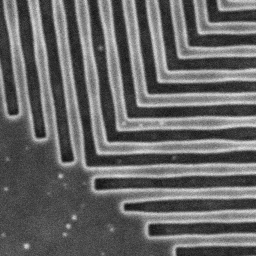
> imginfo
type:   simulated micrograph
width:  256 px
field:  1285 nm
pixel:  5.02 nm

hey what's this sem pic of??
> groups of lines, slits or small figures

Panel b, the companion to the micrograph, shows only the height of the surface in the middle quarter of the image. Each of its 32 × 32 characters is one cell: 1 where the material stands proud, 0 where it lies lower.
11000111000111000111000111000000
11000111000111000111000111000000
11000011000111000111000111111111
11000011000111000011000111111111
11000011000011000011000011111111
11000011000011000011000000000000
11100011000011000011000000000000
11100011000011100011100000000000
01100011100011100011111111111111
01100001100001100011111111111111
01100001100001100000000000000000
01100001100001100000000000000000
01110001100001100000000000000000
01110001100001110000000000000000
01110001110001111111111111111111
01110001110001111111111111111111
00110001110000111100000000000000
00110001110000000000000000000000
00110000110000000000000000000000
00111000111000000000000000000000
00111000111111111111111111111111
00111000111111111111111111111111
00111000000000000000000000000000
00011000000000000000000000000000
00111000000000000000000000000000
11111000000000000000001111111111
11111111111111111111111111111111
11111111111111111111111111111111
11111111000000000000000000000000
11111110000000000000000000000000
11111110000000000000000000000000
11111111000000000001111111000000